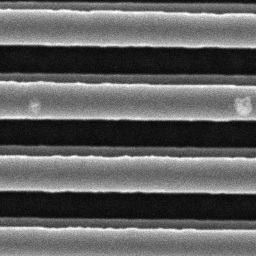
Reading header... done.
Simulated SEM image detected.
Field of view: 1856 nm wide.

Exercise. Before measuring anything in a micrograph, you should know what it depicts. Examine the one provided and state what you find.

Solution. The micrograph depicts lines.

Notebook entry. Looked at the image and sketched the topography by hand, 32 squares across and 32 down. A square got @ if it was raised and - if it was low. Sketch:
@@@@@@@@@@@@@@@@@---------------
@@@@@@@@@@@@@@@@@@@@@@@@@@@@@@@@
@@@@@@@@@@@@@@@@@@@@@@@@@@@@@@@@
@@@@@@@@@@@@@@@@@@@@@@@@@@@@@@@@
@@@@@@@@@@@@@@@@@@@@@@@@@@@@@@@@
@@@@@@@@@@@@@@@@@@@@@@@@@@@@@@@@
--------------------------------
--------------------------------
--------------------------------
@@@@@@@@@@@@@@@@@@@@@@@@@@@@-@@-
@@@@@@@@@@@@@@@@@@@@@@@@@@@@@@@@
@@@@@@@@@@@@@@@@@@@@@@@@@@@@@@@@
@@@@@@@@@@@@@@@@@@@@@@@@@@@@@@@@
@@@@@@@@@@@@@@@@@@@@@@@@@@@@@@@@
@@@@@@@@@@@@@@@@@@@@@@@@@@@@@@@@
--------------------------------
--------------------------------
--------------------------------
@@@@@@@@@@@@@@-@----------------
@@@@@@@@@@@@@@@@@@@@@@@@@@@@@@@@
@@@@@@@@@@@@@@@@@@@@@@@@@@@@@@@@
@@@@@@@@@@@@@@@@@@@@@@@@@@@@@@@@
@@@@@@@@@@@@@@@@@@@@@@@@@@@@@@@@
@@@@@@@@@@@@@@@@@@@@@@@@@@@@@@@@
--------------------------------
--------------------------------
--------------------------------
@@@@@@@@@@@@@@@@-@--------------
@@@@@@@@@@@@@@@@@@@@@@@@@@@@@@@@
@@@@@@@@@@@@@@@@@@@@@@@@@@@@@@@@
@@@@@@@@@@@@@@@@@@@@@@@@@@@@@@@@
@@@@@@@@@@@@@@@@@@@@@@@@@@@@@@@@